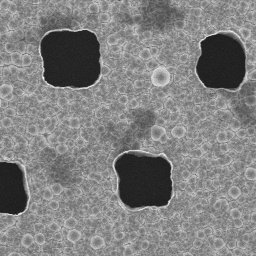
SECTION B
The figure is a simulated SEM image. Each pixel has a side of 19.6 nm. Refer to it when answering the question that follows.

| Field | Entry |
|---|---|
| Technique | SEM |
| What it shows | holes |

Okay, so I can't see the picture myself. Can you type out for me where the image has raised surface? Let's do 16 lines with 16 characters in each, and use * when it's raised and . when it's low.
****************
****************
***...*******..*
***...******...*
***...******...*
*************..*
****************
****************
****************
****************
.******....*****
.******....*****
..******...*****
****************
****************
****************